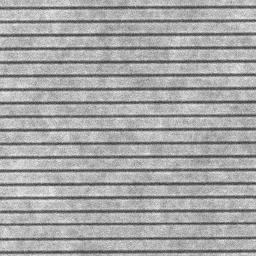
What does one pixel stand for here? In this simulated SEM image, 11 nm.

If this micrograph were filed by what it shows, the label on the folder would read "parallel lines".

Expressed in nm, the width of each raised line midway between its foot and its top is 106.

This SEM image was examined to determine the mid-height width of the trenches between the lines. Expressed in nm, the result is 38.6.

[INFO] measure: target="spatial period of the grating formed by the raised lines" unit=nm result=150